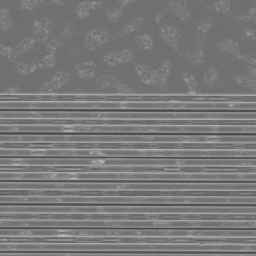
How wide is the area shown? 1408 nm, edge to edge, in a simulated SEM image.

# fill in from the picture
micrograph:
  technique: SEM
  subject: parallel lines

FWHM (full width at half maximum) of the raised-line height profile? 42.7 nm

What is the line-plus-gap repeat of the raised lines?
65.1 nanometres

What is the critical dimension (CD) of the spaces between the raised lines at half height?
5.25 px